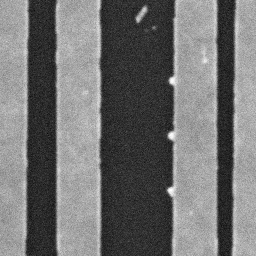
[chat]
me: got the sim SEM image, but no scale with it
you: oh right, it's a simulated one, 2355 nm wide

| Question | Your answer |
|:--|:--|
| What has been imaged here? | lines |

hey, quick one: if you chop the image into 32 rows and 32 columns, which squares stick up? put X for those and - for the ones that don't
XXX----XXXXX----------XXXXX---XX
XXX----XXXXX----------XXXXX---XX
XXX----XXXXX----------XXXXX--XXX
XXX----XXXXX----------XXXXX--XXX
XXX----XXXXX----------XXXXX--XXX
XXX----XXXXX----------XXXXX--XXX
XXX----XXXXX----------XXXXX--XXX
XXX----XXXXX----------XXXXX--XXX
XXX----XXXXX----------XXXXX--XXX
XXX----XXXXX----------XXXXX--XXX
XXX----XXXXX----------XXXXX--XXX
XXX----XXXXX----------XXXXX--XXX
XXX----XXXXX----------XXXXX--XXX
XXX----XXXXX----------XXXXX--XXX
XXX----XXXXX----------XXXXX--XXX
XXX----XXXXX----------XXXXX--XXX
XXX----XXXXX----------XXXXX--XXX
XXX----XXXXX----------XXXXX--XXX
XXX----XXXXX----------XXXXX--XXX
XXX----XXXXX----------XXXXX--XXX
XXX----XXXXX----------XXXXX--XXX
XXX----XXXXX----------XXXXX--XXX
XXX----XXXXX----------XXXXX--XXX
XXX----XXXXX---------XXXXXX--XXX
XXX----XXXXX----------XXXXX--XXX
XXX----XXXXX----------XXXXX--XXX
XXX----XXXXX----------XXXXX--XXX
XXX----XXXXX----------XXXXX--XXX
XXX----XXXXX----------XXXXX--XXX
XXX----XXXXX----------XXXXX--XXX
XXX----XXXXX----------XXXXX--XXX
XXX----XXXXX----------XXXXX--XXX